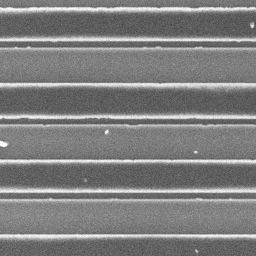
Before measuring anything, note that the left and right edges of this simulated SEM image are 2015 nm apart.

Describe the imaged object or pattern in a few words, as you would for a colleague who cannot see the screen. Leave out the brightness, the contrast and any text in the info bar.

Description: lines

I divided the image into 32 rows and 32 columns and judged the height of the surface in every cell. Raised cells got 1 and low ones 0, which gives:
00000000000000000000000000000000
11111111111111111111111111111111
11111111111111111111111111111111
11111111111111111111111111111111
11111111111111111111111111111111
00000000000000000000000000000000
00000000000000000000000000000000
00000000000000000000000000000000
00000000000000000000000000000000
00000000000000000000000000000000
11111111111111111100010001000010
11111111111111111111111111111111
11111111111111111111111111111111
11111111111111111111111111111111
11111111111111111111111111111111
00000000000000000000000000000000
00000000000000000000000000000000
00000000000000000000000000000000
00000000000000000000000000000000
00000000000000000000000000000000
11111111111111111111111111111111
11111111111111111111111111111111
11111111111111111111111111111111
11111111111111111111111111111111
00000000000000000000000000000000
00000000000000000000000000000000
00000000000000000000000000000000
00000000000000000000000000000000
00000000000000000000000000000000
11111011111111111111111111111111
11111111111111111111111111111111
11111111111111111111111111111111